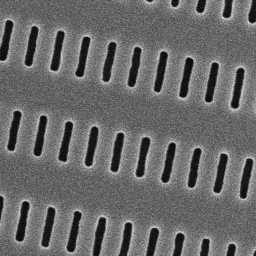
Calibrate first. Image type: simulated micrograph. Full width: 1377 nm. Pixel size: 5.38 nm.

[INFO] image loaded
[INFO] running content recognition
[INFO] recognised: a regular array of holes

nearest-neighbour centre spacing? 140 nanometers